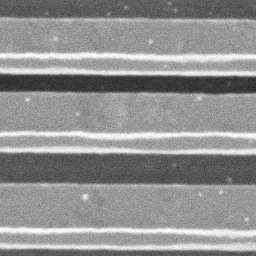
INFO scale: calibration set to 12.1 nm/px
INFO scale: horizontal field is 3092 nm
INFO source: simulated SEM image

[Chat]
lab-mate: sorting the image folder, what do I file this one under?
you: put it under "lines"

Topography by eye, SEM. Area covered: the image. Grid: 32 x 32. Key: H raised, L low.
LLLLLLLLLLLLLLLLLLLLLLLLLLLLLLLL
LLLLLLLLLLLLLLLLLLLLLLLLLLLLLLLL
HHHHHHHHHHHHHHHHHHHHHHHLHHHLLLLL
HHHHHHHHHHHHHHHHHHHHHHHHHHHHHHHH
HHHHHHHHHHHHHHHHHHHHHHHHHHHHHHHH
HHHHHHHHHHHHHHHHHHHHHHHHHHHHHHHH
HHHHHHHHHHHHHHHHHHHHHHHHHHHHHHHH
HHHHHHHHHHHHHHHHHHHHHHHHHHHHHHHH
HHHHHHHHHHHHHHHHHHHHHHHHHHHHHHHH
LLLLLLLLLLLLLLLLLLLLLLLLLLLLLLLL
LLLLLLLLLLLLLLLLLLLLLLLLLLLLLLLL
LLLLLLLLLLLLLLLLLLLLLLLLLLLLLLLL
HHHHHHHHHHHHHHHHHHHHHHHHHHHHHHHH
HHHHHHHHHHHHHHHHHHHHHHHHHHHHHHHH
HHHHHHHHHHHHHHHHHHHHHHHHHHHHHHHH
HHHHHHHHHHHHHHHHHHHHHHHHHHHHHHHH
HHHHHHHHHHHHHHHHHHHHHHHHHHHHHHHH
HHHHHHHHHHHHHHHHHHHHHHHHHHHHHHHH
HHHHHHHHHHHHHHHHHHHHHHHHHHHHHHHH
LLLLLLLLLLLLLLLLLLLLLLLLLLLLLLLL
LLLLLLLLLLLLLLLLLLLLLLLLLLLLLLLL
LLLLLLLLLLLLLLLLLLLLLLLLLLLLLLLL
LLLLLLLLLLLLLLLLLLLLLLLLLLLLLLLL
HHHHHHHHHHHHHHHHHHHHHHHHHHHHHHHH
HHHHHHHHHHHHHHHHHHHHHHHHHHHHHHHH
HHHHHHHHHHHHHHHHHHHHHHHHHHHHHHHH
HHHHHHHHHHHHHHHHHHHHHHHHHHHHHHHH
HHHHHHHHHHHHHHHHHHHHHHHHHHHHHHHH
HHHHHHHHHHHHHHHHHHHHHHHHHHHHHHHH
HHHHHHHHHHHHHHHHHHHHHHHHHHHHHHHH
HHHHHHHHHHHHHHHHHHHHHHHHHHHHHHHH
LLLLLLLLLLLLLLLLLLLLLLLLLLLLLLLL